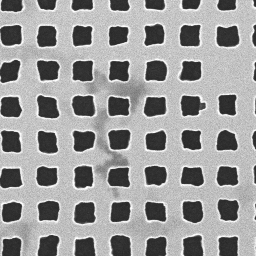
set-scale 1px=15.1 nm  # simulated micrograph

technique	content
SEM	a regular array of holes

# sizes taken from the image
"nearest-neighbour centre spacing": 0.525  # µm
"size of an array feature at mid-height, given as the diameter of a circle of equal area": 327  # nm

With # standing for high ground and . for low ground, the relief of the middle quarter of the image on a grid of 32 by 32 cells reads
##.....####.....#####.....####..
##.....####.....####......####..
##.....####.....####......###...
##.....####.....####.....####...
################################
################################
################################
################################
##.....####.....#####....####...
##.....####.....####......###...
##......###.....####......###...
##......###.....####.....####...
###....####.....####.....####...
################################
################################
################################
############.#..################
##......###......####....####...
##......###......###......###...
##......###.....####.....####...
##.....#####....#####....#####..
###...######..#######....#######
################################
################################
################################
######################.#.#######
###....#####....####.....#####..
###....####.....####......###...
###....####.....####......###...
###....####.....#####....####...
###....#####....################
################################